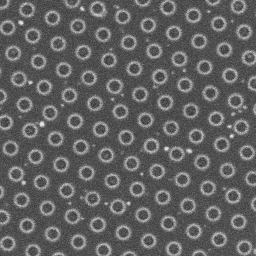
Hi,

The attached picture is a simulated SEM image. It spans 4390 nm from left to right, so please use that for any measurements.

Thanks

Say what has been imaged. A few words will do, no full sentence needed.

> a regular array of holes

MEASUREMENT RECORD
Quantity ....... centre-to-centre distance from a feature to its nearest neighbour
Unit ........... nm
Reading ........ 451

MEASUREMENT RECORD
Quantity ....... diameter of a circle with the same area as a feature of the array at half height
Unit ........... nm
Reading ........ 195